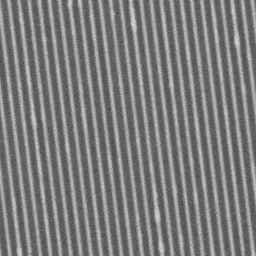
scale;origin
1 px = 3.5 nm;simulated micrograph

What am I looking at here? parallel lines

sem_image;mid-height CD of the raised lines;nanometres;10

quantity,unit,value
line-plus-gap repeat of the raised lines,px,10.1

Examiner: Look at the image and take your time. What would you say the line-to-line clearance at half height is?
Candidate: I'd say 26.5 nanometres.